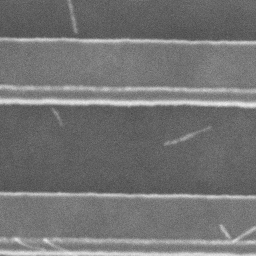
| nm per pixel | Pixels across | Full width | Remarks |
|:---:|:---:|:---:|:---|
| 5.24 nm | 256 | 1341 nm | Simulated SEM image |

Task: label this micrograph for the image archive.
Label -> lines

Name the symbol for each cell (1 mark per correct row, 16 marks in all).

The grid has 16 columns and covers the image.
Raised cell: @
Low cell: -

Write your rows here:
----------------
----------------
@@@@@@@@@-------
@@@@@@@@@@@@@@@@
@@@@@@@@@@@@@@@@
@@@@@@@@@@@@@@@@
---------------@
----------------
----------------
----------------
----------------
----------------
@@@@@@@@@@@@@@@@
@@@@@@@@@@@@@@@@
@@@@@@@@@@@@@@@@
@@@@@@@@@@@@@@@@